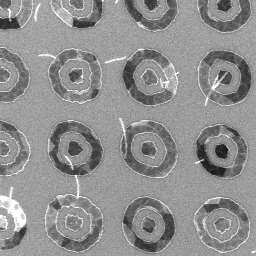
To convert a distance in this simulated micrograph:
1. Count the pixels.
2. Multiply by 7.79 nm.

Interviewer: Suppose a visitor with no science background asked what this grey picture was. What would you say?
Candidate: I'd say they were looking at a regular array of ring-shaped raised bodies with a dot in the middle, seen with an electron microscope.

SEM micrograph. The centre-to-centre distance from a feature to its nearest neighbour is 72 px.